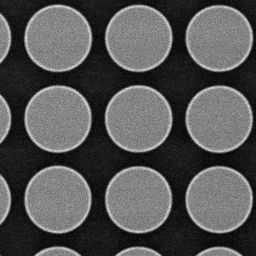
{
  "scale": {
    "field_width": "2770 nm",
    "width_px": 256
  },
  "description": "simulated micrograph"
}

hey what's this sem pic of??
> an array of small figures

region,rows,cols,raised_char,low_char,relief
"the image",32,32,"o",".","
................................
.....ooooo.....ooooo.....ooooo..
o...ooooooo...ooooooo...ooooooo.
o..oooooooo..oooooooo..oooooooo.
o..oooooooo..oooooooo..oooooooo.
o..oooooooo..oooooooo..oooooooo.
o..oooooooo...ooooooo...ooooooo.
....oooooo....oooooo....oooooo..
.....oooo......oooo.......ooo...
................................
................................
.....ooooo.....ooooo.....ooooo..
o...ooooooo...ooooooo...ooooooo.
o..oooooooo..oooooooo..oooooooo.
o..oooooooo..oooooooo..oooooooo.
o..oooooooo..oooooooo..oooooooo.
o..oooooooo...ooooooo...ooooooo.
....oooooo....ooooooo...ooooooo.
.....oooo......oooo......oooo...
................................
................................
.....ooooo.....ooooo.....ooooo..
o...ooooooo...ooooooo...ooooooo.
o..oooooooo...ooooooo...ooooooo.
o..oooooooo..oooooooo..oooooooo.
o..oooooooo..oooooooo..oooooooo.
o..oooooooo...ooooooo...ooooooo.
....oooooo....ooooooo...ooooooo.
.....oooo......ooooo.....ooooo..
................................
................................
.....oooo......oooo......oooo...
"